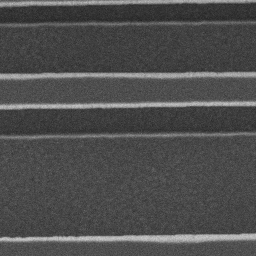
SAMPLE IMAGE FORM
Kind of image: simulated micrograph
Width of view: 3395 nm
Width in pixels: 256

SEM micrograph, lines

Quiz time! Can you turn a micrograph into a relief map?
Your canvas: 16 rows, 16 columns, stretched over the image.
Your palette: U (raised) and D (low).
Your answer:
DDDDDDDDDDDDDDDD
DDDDDDDDDDDDDDDD
DDDDDDDDDDDDDDDD
DDDDDDDDDDDDDDDD
DDDDDDDDDDDDDDDD
UUUUUUUUUUUUUUUU
UUUUUUUUUUUUUUUU
DDDDDDDDDDDDDDDD
DDDDDDDDDDDDDDDD
DDDDDDDDDDDDDDDD
DDDDDDDDDDDDDDDD
DDDDDDDDDDDDDDDD
DDDDDDDDDDDDDDDD
DDDDDDDDDDDDDDDD
DDDDDDDDDDDDDDDD
UUUUUUUUUUUUUUUU